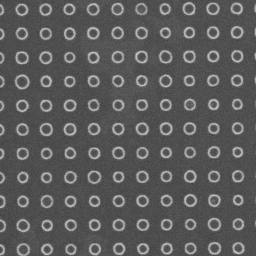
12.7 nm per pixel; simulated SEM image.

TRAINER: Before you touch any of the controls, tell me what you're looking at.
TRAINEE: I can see a regular array of raised bodies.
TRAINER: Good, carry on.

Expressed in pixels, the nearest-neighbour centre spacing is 23.6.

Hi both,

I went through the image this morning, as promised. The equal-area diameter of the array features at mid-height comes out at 137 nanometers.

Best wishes